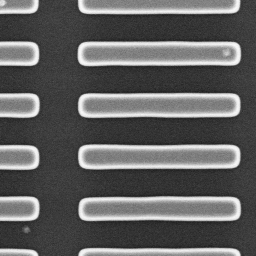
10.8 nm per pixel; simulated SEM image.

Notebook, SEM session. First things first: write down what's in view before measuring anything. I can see groups of lines, slits or small figures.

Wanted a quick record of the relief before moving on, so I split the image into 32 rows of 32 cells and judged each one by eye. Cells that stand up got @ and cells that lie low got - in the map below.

@@@@@-----@@@@@@@@@@@@@@@@@@@@--
@@@@-------@@@@@@@@@@@@@@@@@@---
--------------------------------
--------------------------------
--------------------------------
@@@@-------@@@@@@@@@@@@@@@@@@---
@@@@@-----@@@@@@@@@@@@@@@@@@@@--
@@@@@-----@@@@@@@@@@@@@@@@@@@@--
--------------------------------
--------------------------------
--------------------------------
--------------------------------
@@@@@-----@@@@@@@@@@@@@@@@@@@@--
@@@@@-----@@@@@@@@@@@@@@@@@@@@--
@@@@-------@@@@@@--@@@@@@@@-----
--------------------------------
--------------------------------
--------------------------------
@@@@------@@@@@@@@@@@@@@@@@@@---
@@@@@-----@@@@@@@@@@@@@@@@@@@@--
@@@@@-----@@@@@@@@@@@@@@@@@@@@--
--------------------------------
--------------------------------
--------------------------------
--------------------------------
@@@@@-----@@@@@@@@@@@@@@@@@@@@--
@@@@@-----@@@@@@@@@@@@@@@@@@@@--
--------------------------------
--------------------------------
--------------------------------
--------------------------------
@@@@------@@@@@@@@@@@@@@@@@@@@--